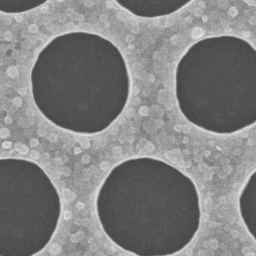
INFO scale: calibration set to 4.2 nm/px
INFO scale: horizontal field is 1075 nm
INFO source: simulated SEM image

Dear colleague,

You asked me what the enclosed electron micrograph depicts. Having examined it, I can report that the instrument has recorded holes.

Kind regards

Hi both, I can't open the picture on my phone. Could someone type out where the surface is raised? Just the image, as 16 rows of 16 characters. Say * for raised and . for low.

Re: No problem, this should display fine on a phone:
..******...*****
****************
***....******..*
**......***.....
**......***.....
**......***.....
**......***.....
***....*****....
****************
****************
...****....*****
...***......***.
....**......***.
....**.......**.
...****.....****
...*****...*****